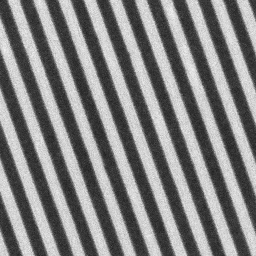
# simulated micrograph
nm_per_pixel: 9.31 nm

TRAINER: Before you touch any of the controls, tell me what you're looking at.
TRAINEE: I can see parallel lines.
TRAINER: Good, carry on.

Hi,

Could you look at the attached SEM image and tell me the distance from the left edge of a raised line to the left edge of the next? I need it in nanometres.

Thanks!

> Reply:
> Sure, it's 223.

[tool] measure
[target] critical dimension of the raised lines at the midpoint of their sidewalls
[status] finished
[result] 0.144 um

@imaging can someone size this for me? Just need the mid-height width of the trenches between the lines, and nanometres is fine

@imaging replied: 78.9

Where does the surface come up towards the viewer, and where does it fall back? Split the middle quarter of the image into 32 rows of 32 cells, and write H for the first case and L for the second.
LHHHHLLHHHHLLHHHHHLLHHHHLLHHHHLL
LHHHHLLLHHHHLLHHHHLLHHHHLLLHHHHL
LHHHHHLLHHHHLLHHHHLLLHHHHLLHHHHL
LLHHHHLLHHHHLLLHHHHLLHHHHLLHHHHL
LLHHHHLLLHHHHLLHHHHLLHHHHLLLHHHH
LLHHHHHLLHHHHLLHHHHLLLHHHHLLHHHH
HLLHHHHLLHHHHLLLHHHHLLHHHHLLHHHH
HLLHHHHLLLHHHHLLHHHHLLHHHHLLLHHH
HLLLHHHHLLHHHHLLHHHHLLLHHHHLLHHH
HHLLHHHHLLHHHHLLLHHHHLLHHHHLLHHH
HHLLHHHHLLLHHHHLLHHHHLLHHHHLLLHH
HHLLLHHHHLLHHHHLLHHHHHLLHHHHLLHH
HHHLLHHHHLLHHHHHLLHHHHLLHHHHLLHH
HHHLLHHHHHLLHHHHLLHHHHLLHHHHHLLH
HHHLLLHHHHLLHHHHLLHHHHHLLHHHHLLH
HHHHLLHHHHLLLHHHHLLHHHHLLHHHHLLL
HHHHLLHHHHHLLHHHHLLHHHHLLLHHHHLL
HHHHHLLHHHHLLHHHHLLLHHHHLLHHHHLL
LHHHHLLHHHHLLLHHHHLLHHHHLLHHHHLL
LHHHHLLLHHHHLLHHHHLLHHHHLLLHHHHL
LLHHHHLLHHHHLLHHHHLLLHHHHLLHHHHL
LLHHHHLLHHHHLLLHHHHLLHHHHLLHHHHL
LLHHHHLLLHHHHLLHHHHLLHHHHLLLHHHH
LLLHHHHLLHHHHLLHHHHLLLHHHHLLHHHH
HLLHHHHLLHHHHLLLHHHHLLHHHHLLHHHH
HLLHHHHHLLHHHHLLHHHHLLHHHHHLLHHH
HLLLHHHHLLHHHHLLHHHHHLLHHHHLLHHH
HHLLHHHHLLHHHHLLLHHHHLLHHHHLLHHH
HHLLHHHHHLLHHHHLLHHHHLLLHHHHLLHH
HHLLLHHHHLLHHHHLLLHHHHLLHHHHLLHH
HHHLLHHHHLLHHHHHLLHHHHLLHHHHLLLH
HHHLLHHHHHLLHHHHLLHHHHLLLHHHHLLH